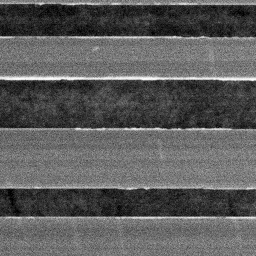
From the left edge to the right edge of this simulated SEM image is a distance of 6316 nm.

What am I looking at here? lines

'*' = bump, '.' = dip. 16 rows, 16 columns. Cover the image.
................
................
****************
****************
****************
................
................
................
****************
****************
****************
****************
................
................
****************
****************